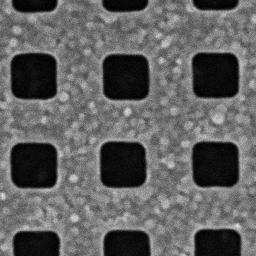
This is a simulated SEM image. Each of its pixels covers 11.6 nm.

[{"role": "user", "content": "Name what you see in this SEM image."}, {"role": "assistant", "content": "holes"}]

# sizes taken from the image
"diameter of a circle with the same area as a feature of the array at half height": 51.6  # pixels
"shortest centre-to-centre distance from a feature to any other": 1030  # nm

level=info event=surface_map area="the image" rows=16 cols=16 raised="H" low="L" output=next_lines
HLLHHHHLLHHHLLLH
HHHHHHHHHHHHHHHH
HHHHHHHHHHHHHHHH
HLLHHHHLLHHHLLLH
HLLLHHLLLHHHLLLH
HLLLHHLLLHHHLLLH
HHHHHHHHHHHHHHHH
HHHHHHHHHHHHHHHH
HHHHHHHHHHHHHHHH
HLLLHHLLLHHHLLLH
HLLLHHLLLHHHLLLH
HLLHHHHLLHHHLLLH
HHHHHHHHHHHHHHHH
HHHHHHHHHHHHHHHH
HLLHHHHLLHHHLLLH
HLLLHHLLLHHHLLLH